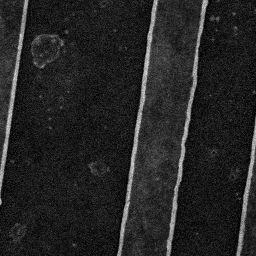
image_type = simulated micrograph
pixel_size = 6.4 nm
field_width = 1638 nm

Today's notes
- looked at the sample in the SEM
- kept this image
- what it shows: one or a few lines or trenches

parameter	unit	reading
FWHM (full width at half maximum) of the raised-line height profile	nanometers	314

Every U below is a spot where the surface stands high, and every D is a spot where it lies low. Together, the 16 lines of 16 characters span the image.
UUDDDDDDDDUUUDDD
UDDDDDDDDDUUUDDD
UDDDDDDDDUUUDDDD
UDDDDDDDDUUUDDDD
UDDDDDDDDUUUDDDD
UDDDDDDDDUUUDDDD
UDDDDDDDDUUUDDDD
UDDDDDDDDUUUDDDD
DDDDDDDDDUUUDDDD
DDDDDDDDUUUDDDDD
DDDDDDDDUUUDDDDD
DDDDDDDDUUUDDDDD
DDDDDDDDUUUDDDDU
DDDDDDDDUUUDDDDU
DDDDDDDDUUUDDDDU
DDDDDDDDUUUDDDDU